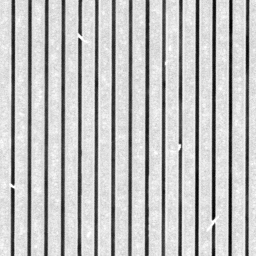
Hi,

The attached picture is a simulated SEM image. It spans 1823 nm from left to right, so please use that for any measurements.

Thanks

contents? parallel lines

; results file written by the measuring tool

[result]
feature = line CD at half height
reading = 0.0916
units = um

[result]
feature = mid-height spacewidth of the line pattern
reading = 4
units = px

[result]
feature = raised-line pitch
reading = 119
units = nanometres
